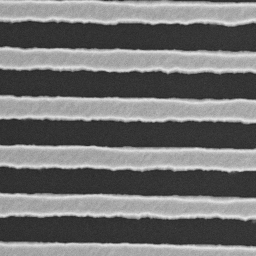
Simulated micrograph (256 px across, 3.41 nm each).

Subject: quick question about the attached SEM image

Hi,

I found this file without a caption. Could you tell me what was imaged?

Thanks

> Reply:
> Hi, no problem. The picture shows lines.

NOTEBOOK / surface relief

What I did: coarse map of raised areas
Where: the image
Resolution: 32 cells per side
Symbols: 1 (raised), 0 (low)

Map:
11111111111111111111111111111111
11111111111111111111111111111111
11111111111111111111111111111111
00000000000000000000000000000000
00000000000000000000000000000000
00000000000000000000000000000000
11111111111111111111111111110000
11111111111111111111111111111111
11111111111111111111111111111111
00000000000000000000000000000000
00000000000000000000000000000000
00000000000000000000000000000000
11111111111111111111111111111111
11111111111111111111111111111111
11111111111111111111111111111111
00000000000000000000000000000000
00000000000000000000000000000000
00000000000000000000000000000000
11111111111111111000100110000000
11111111111111111111111111111111
11111111111111111111111111111111
00000000000000000000000000000000
00000000000000000000000000000000
00000000000000000000000000000000
11111111111111111100000000000000
11111111111111111111111111111111
11111111111111111111111111111111
00000000000000000000000000000010
00000000000000000000000000000000
00000000000000000000000000000000
11111111111110010000000000000000
11111111111111111111111111111111